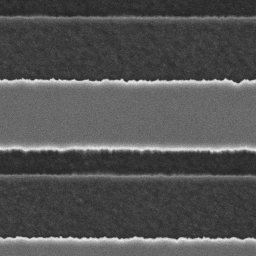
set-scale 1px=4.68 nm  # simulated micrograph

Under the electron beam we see lines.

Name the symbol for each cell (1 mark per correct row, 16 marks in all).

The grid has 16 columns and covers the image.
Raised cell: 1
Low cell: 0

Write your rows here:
0000000000000000
0000000000000000
0000000000000000
0000000000000000
0000000000000000
1111111111111111
1111111111111111
1111111111111111
1111111111111111
0000000000000000
0000000000000000
0000000000000000
0000000000000000
0000000000000000
0000000000000000
1111111111111111